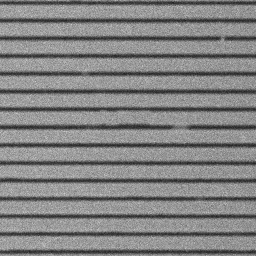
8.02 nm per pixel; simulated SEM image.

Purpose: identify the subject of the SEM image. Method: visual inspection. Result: parallel lines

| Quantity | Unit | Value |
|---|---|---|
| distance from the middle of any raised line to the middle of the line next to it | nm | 143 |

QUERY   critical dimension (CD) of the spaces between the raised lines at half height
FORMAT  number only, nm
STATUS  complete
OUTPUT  35.1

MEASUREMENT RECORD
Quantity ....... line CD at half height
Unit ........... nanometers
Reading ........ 107